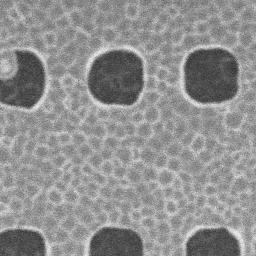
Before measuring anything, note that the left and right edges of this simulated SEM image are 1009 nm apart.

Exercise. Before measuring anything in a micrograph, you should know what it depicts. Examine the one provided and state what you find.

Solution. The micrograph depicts holes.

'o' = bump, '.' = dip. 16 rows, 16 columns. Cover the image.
oooooooooooooooo
oooooooooooooooo
oooooooooooooooo
..oooo...ooo...o
...oo....oo....o
...ooo...oo....o
..oooo..oooo..oo
oooooooooooooooo
oooooooooooooooo
oooooooooooooooo
oooooooooooooooo
oooooooooooooooo
oooooooooooooooo
oooooooooooooooo
..oooo..oooo...o
...oo....ooo...o